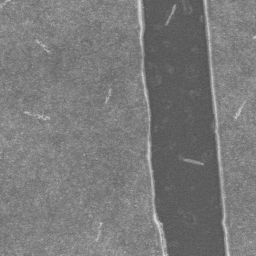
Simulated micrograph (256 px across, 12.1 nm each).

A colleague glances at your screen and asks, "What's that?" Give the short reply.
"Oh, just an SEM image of one or a few lines or trenches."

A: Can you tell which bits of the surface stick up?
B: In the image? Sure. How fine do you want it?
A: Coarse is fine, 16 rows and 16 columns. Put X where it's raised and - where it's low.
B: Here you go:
XXXXXXXXX----XXX
XXXXXXXXX----XXX
XXXXXXXXX----XXX
XXXXXXXXX----XXX
XXXXXXXXX----XXX
XXXXXXXXX----XXX
XXXXXXXXX----XXX
XXXXXXXXX-----XX
XXXXXXXXX-----XX
XXXXXXXXX-----XX
XXXXXXXXX-----XX
XXXXXXXXXX----XX
XXXXXXXXXX----XX
XXXXXXXXXX----XX
XXXXXXXXXX----XX
XXXXXXXXXX----XX